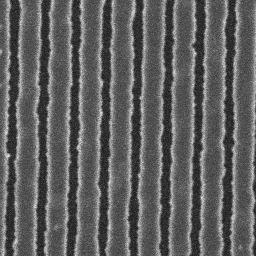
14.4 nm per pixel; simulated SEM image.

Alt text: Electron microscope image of parallel lines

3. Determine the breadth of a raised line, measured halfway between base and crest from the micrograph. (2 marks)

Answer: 0.307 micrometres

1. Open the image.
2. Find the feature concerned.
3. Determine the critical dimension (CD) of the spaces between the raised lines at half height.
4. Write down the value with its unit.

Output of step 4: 137 nm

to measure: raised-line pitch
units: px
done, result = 30.9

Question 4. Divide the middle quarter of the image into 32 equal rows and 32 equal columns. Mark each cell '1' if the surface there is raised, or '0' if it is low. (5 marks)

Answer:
11001111100011111000111110011111
11001111100011111000111110011111
11001111100011111000111110011111
11001111100011111000111110011111
11001111100011111000111110011111
11001111110011111000111110011111
11001111100111111001111110011111
11001111100011111000111110011111
11001111100011111001111110011111
11001111100011111001111110011111
10001111100011111001111110011111
10001111100011111001111110011111
10001111100011111000111110011111
11001111100011111001111110011111
10001111100011111001111100011111
10001111100111111001111110011111
10001111100111111001111110011111
10001111100011111001111100011111
10001111100111111001111100011111
10001111100111111001111100011111
10011111100011111001111100011111
10011111100011111001111100011111
10001111100011111001111100011111
10001111100111110001111100011111
10001111100111111001111100011111
10001111100111111001111100011111
10001111100111111001111100011111
10001111100111111001111110011111
10011111100111111001111100111111
10001111000111111001111100011111
10001111100111111001111100011111
10011111100111111001111100011111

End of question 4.